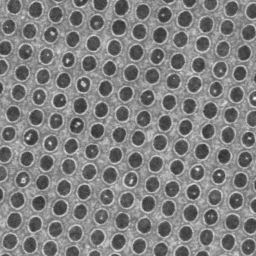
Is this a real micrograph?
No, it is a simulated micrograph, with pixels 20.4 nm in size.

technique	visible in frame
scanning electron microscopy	a regular array of holes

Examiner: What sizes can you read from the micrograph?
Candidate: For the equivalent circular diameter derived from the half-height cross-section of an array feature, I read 314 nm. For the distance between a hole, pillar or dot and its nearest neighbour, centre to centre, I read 0.418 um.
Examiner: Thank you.